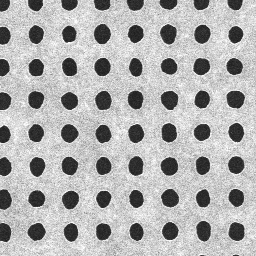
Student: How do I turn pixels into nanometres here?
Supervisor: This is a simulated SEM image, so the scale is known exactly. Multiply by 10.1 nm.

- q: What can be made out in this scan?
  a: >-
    a regular array of holes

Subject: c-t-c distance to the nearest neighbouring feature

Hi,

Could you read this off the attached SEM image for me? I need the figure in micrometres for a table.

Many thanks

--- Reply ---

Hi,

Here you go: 0.329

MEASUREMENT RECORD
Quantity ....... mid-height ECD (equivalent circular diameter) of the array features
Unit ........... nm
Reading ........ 172